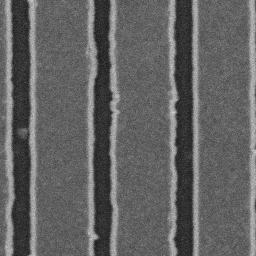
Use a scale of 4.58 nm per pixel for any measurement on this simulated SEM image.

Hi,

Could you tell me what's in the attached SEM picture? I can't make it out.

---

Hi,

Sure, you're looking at one or a few lines or trenches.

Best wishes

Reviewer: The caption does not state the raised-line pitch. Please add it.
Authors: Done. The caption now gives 0.371 micrometres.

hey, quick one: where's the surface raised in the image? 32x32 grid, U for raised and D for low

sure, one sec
UDDDUUUUUUUDDDUUUUUUUUDDUUUUUUUD
UDDDUUUUUUUDDDUUUUUUUUDDUUUUUUUU
UDDDUUUUUUUDDDUUUUUUUUDDUUUUUUUU
UDDDUUUUUUUDDDUUUUUUUDDDUUUUUUUU
UDDDUUUUUUUDDDUUUUUUUDDDUUUUUUUU
UDDDUUUUUUUUDDUUUUUUUUDDUUUUUUUU
UDDDUUUUUUUUDDUUUUUUUUDDUUUUUUUU
UDDDUUUUUUUUDDUUUUUUUUDDUUUUUUUU
UDDDUUUUUUUUDDUUUUUUUUDDUUUUUUUU
UDDDUUUUUUUUDDUUUUUUUUDDUUUUUUUU
UDDDUUUUUUUDDDUUUUUUUUDDUUUUUUUU
UDDDUUUUUUUDDDUUUUUUUUDDUUUUUUUU
UDDDUUUUUUUDDDUUUUUUUUDDUUUUUUUU
UDDDUUUUUUUDDDUUUUUUUUDDUUUUUUUU
UDDDUUUUUUUDDDUUUUUUUUDDUUUUUUUU
UDDDUUUUUUUDDDUUUUUUUUDDUUUUUUUU
UDDDUUUUUUUDDDUUUUUUUUDDUUUUUUUU
UDDDUUUUUUUDDDUUUUUUUUDDUUUUUUUU
UDDDUUUUUUUDDDUUUUUUUUDDUUUUUUUU
UDDDUUUUUUUDDDUUUUUUUUDDUUUUUUUU
UDDDUUUUUUUDDDUUUUUUUUDDUUUUUUUU
UDDDUUUUUUUDDDUUUUUUUUDDUUUUUUUU
UDDDUUUUUUUDDDUUUUUUUUDDUUUUUUUU
UDDDUUUUUUUDDDUUUUUUUUDDUUUUUUUU
UDDDUUUUUUUDDDUUUUUUUUDDUUUUUUUU
UDDDUUUUUUUDDDUUUUUUUUDDUUUUUUUU
UDDDUUUUUUUDDDUUUUUUUUDDUUUUUUUU
UDDDUUUUUUUDDDUUUUUUUUDDDUUUUUUU
UDDDUUUUUUUDDDUUUUUUUUDDDUUUUUUU
UDDDUUUUUUUUDDUUUUUUUUDDDUUUUUUU
UDDDUUUUUUUDDDUUUUUUUUDDDUUUUUUU
UDDDUUUUUUUDDDUUUUUUUUDDDUUUUUUU